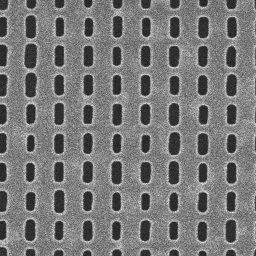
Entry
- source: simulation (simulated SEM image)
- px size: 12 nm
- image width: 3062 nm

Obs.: a regular array of holes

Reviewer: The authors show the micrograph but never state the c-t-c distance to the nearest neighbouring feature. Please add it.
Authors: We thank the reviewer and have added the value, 341 nanometres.